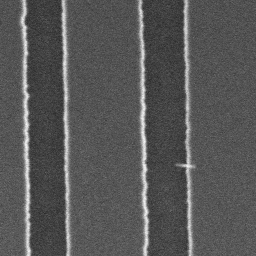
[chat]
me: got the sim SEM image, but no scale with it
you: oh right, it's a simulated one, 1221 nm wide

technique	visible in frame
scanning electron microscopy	lines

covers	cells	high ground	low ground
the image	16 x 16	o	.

oo..ooooo...oooo
oo..ooooo...oooo
oo..ooooo...oooo
oo..ooooo...oooo
oo..ooooo...oooo
oo..ooooo...oooo
oo..ooooo...oooo
oo..ooooo...oooo
oo..ooooo...oooo
oo..ooooo...oooo
oo..ooooo...oooo
oo..ooooo...oooo
oo..ooooo...oooo
oo..ooooo...oooo
oo..ooooo...oooo
oo..ooooo...oooo